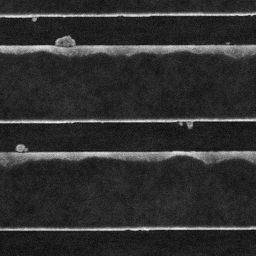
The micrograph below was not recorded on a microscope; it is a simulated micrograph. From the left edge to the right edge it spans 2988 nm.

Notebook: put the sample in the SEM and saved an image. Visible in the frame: lines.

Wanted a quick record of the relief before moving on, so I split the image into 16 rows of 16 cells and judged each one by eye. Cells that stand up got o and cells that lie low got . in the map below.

oooooooooooooooo
................
................
oooooooooooooooo
oooooooooooooooo
oooooooooooooooo
oooooooooooooooo
oooooooooooooooo
................
................
oooooooooooooooo
oooooooooooooooo
oooooooooooooooo
oooooooooooooooo
................
................